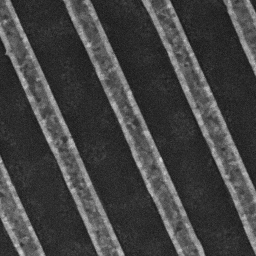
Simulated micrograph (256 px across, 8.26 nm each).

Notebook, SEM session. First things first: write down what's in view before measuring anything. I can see one or a few lines or trenches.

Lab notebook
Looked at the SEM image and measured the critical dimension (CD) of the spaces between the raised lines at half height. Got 52.3 px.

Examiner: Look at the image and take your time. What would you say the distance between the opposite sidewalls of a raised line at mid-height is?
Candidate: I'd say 170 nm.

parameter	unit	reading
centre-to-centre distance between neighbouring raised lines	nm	602